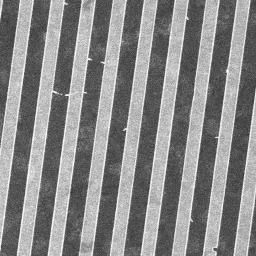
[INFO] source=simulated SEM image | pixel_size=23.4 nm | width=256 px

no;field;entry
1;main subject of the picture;parallel lines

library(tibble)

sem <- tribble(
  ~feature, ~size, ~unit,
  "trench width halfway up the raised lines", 424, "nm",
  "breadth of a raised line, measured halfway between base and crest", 293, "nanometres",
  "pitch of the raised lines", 720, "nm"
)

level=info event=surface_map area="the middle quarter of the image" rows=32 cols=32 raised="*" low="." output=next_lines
..****....***.....***.....***...
..***.....***.....***.....***...
..***.....***.....***....****...
..***.....***.....***....***....
..***.....***....***.....***....
..***.....***....***.....***....
..***....***.....***.....***....
.****....***.....***.....***....
.****....***.....***.....***....
.***.....***.....***....****....
.***.....***.....***....***.....
.***.....***.....**.....***.....
.***.....***....***.....***.....
.***.....***....***.....***.....
.***....***.....***.....***.....
****....***.....***.....***.....
***.....***.....***.....***....*
***.....***.....***....****....*
***.....***.....***....***.....*
***.....***....***.....***.....*
***.....***....***.....***.....*
***....***.....***.....***.....*
***....***.....***.....***....**
**.....***.....***.....***....**
**.....***.....***....****....**
**.....***.....***....***.....**
**.....***..**.**.....***.....**
**.....***....***.....***.....**
**.....***....***.....***.....**
**....***.....***.....***.....**
**....***.....***.....***.....**
*.....***.....***.....***....***